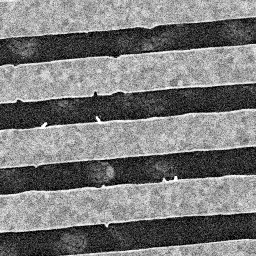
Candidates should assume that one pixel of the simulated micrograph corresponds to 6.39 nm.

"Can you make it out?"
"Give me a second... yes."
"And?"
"one or a few lines or trenches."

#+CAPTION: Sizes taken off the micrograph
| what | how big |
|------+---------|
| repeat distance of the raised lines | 412 nm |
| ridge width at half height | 233 nanometres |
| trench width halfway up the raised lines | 0.176 um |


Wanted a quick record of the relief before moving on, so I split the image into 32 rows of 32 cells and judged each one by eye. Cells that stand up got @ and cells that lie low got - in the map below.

@@@@@@@@@@@@@@@@@@@@@@@@@@@@@@@@
@@@@@@@@@@@@@@@@@@@@@@@@@@@@@@@@
@@@@@@@@@@@@@@@@@@@@@@@@@@@-----
@@@@@@@@@@@@@@@@--@-------------
@@@@----------------------------
--------------------------------
---------------------@@@@@@@@@@@
--------@@@@@@@@@@@@@@@@@@@@@@@@
@@@@@@@@@@@@@@@@@@@@@@@@@@@@@@@@
@@@@@@@@@@@@@@@@@@@@@@@@@@@@@@@@
@@@@@@@@@@@@@@@@@@@@@@@@@@@@@---
@@@@@@@@@@@@@@@@@---------------
@@@@@@--------------------------
--------------------------------
----------------------@@@@@@@@@@
----------@@@@@@@@@@@@@@@@@@@@@@
@@@@@@@@@@@@@@@@@@@@@@@@@@@@@@@@
@@@@@@@@@@@@@@@@@@@@@@@@@@@@@@@@
@@@@@@@@@@@@@@@@@@@@@@@@@@@@@---
@@@@@@@@@@@@@@@@@---------------
@@@@@---------------------------
--------------------------------
----------------------@@@@@@@@@@
------------@@@@@@@@@@@@@@@@@@@@
@@@@@@@@@@@@@@@@@@@@@@@@@@@@@@@@
@@@@@@@@@@@@@@@@@@@@@@@@@@@@@@@@
@@@@@@@@@@@@@@@@@@@@@@@@@@@@@@@-
@@@@@@@@@@@@@@@@@---------------
@@@@@@@-------------------------
--------------------------------
-------------------------@@@@@@@
--------------@@@@@@@@@@@@@@@@@@